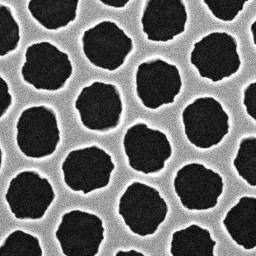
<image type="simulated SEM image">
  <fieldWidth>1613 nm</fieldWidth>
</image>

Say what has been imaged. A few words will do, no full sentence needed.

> a regular array of holes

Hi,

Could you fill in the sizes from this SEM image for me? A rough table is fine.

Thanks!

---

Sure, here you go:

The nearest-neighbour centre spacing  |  390 nm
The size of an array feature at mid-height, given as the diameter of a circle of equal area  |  303 nanometres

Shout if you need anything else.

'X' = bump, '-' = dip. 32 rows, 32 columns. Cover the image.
XXXX------XXX---XX-----XXX-----X
-XXX------XXXXXXXX-----XXX----XX
--XX-----XXXXXXXXX-----XXXXX-XXX
--XXXX--XXX----XXX-----XXXXXXXX-
--XXXXXXXX------XX----XXXX---XXX
--XX--XXXX-------XXXXXXX------XX
-XX-----XX------XXXXXXXX------XX
XXX------XX-----XXX-XXXX------XX
XXX------XXXX--XX-----XXX-----XX
XXX------XXXXXXXX------XX----XXX
-XXX----XXXX--XXX------XXXXXXXX-
-XXXXXXXXX-----XX-----XXXXXXXXX-
-XXXXXXXXX-----XXX----XX---XXX--
-XXX--XXXX-----XXXX-XXX-----XXX-
XXX----XXX-----XXXXXXXX------XX-
XX-----XXX-----XX-XXXXX------XXX
XX-----XXXXXXXXX----XXX-----XXXX
XX-----XXXXXXXX------XXX----XX--
XX-----XXXX-XXXX-----XXXX-XXXX--
XXX---XX------XX-----XXXXXXXX---
XXXXXXXX------XX-----XXX-XXXX---
XXX-XXXX------XXXX--XX-----XXX--
X-----XX------XXXXXXXX------XXX-
X-----XXX----XXX---XXX------XXXX
X------XXXXXXXX-----XX-----XXXXX
X-----XXXXXXXXX------XX----XXX--
XX----XXX--XXXX------XXXXXXXX---
XXXXXXXX-----XX-----XXXXXXXX----
XXXXXXX------XXX----XXX--XXX----
X---XXX------XXXXXXXXX----XXX---
-----XX------XXXXXXXX------XXX--
-----XXX----XXX--XXXX------XXXXX